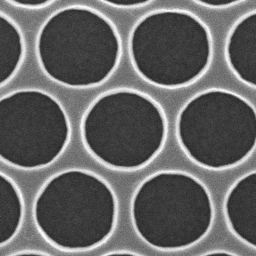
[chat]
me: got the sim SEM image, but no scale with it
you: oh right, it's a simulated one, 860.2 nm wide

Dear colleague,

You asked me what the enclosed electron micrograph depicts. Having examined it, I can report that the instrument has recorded holes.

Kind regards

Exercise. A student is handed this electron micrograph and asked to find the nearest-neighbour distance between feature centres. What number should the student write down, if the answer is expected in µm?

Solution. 0.315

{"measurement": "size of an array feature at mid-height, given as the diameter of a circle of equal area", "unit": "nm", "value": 266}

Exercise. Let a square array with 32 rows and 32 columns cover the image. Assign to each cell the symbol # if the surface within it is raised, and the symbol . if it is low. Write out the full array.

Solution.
##...#########....########...###
#######.....########...#########
.#####.......#####.......#####..
..###.........###.........###...
...##..........#..........###...
...##..........#..........##....
...##..........#..........##....
...##..........##.........###...
..###.........###.........###...
.#####.......#####.......#####..
########....########...########.
##...#########...#########..####
.......#####.......#####......##
........###.........###.........
........###.........###.........
........##...........#..........
.........#...........#..........
........###.........###.........
........###.........###.........
.......#####.......#####.......#
#.....#######.....#######....###
#########.######################
.#####.......######.....######..
..###.........###........####...
..###.........###.........###...
...#..........###.........##....
...#..........###.........##....
...##.........###.........###...
..###.........###.........###...
..####.......#####.......#####..
#######.....#######.....#######.
################################